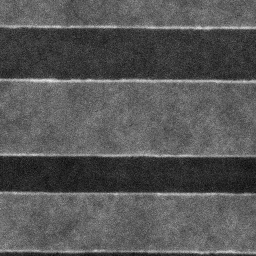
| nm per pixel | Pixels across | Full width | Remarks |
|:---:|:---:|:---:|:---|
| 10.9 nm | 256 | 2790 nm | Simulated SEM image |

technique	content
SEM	lines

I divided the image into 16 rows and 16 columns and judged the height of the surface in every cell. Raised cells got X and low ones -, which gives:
XXXXXXXXXXXXXXXX
XXXXXXXXXXXXXXXX
----------------
----------------
----------------
XXXXXXXXXXXXXXXX
XXXXXXXXXXXXXXXX
XXXXXXXXXXXXXXXX
XXXXXXXXXXXXXXXX
XXXXXXXXXXXXXXXX
----------------
----------------
XXXXXXXXXXXXXXXX
XXXXXXXXXXXXXXXX
XXXXXXXXXXXXXXXX
XXXXXXXXXXXXXXXX